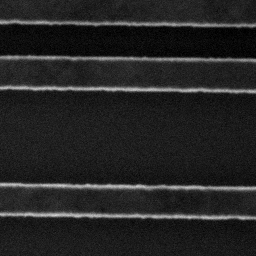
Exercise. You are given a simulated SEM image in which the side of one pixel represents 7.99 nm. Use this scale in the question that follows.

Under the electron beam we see lines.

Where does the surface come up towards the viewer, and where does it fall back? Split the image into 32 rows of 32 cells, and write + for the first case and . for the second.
++++++++++++++++++++++++++++++++
++++++++++++++++++++++++++++++++
++++++++++++++++++++++++++++++++
................................
................................
................................
................................
++++++++++++++++++++++++++++++++
++++++++++++++++++++++++++++++++
++++++++++++++++++++++++++++++++
++++++++++++++++++++++++++++++++
............................++.+
................................
................................
................................
................................
................................
................................
................................
................................
................................
................................
................................
++++++++++++++++++++++++++++++++
++++++++++++++++++++++++++++++++
++++++++++++++++++++++++++++++++
++++++++++++++++++++++++++++++++
................................
................................
................................
................................
................................